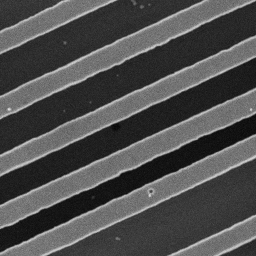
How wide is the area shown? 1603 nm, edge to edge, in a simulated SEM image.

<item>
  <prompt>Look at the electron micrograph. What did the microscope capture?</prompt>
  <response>lines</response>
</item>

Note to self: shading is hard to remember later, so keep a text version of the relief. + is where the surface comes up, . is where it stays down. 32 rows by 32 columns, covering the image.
.......+++++++...........++++++.
.....++++++...........+++++++...
...++++++...........+++++++.....
.++++++...........+++++++.......
+++++...........+++++++.........
+++...........+++++++.........++
+...........++++++.........+++++
..........++++++.........++++++.
.......+++++++.........++++++...
.....+++++++.........++++++.....
...+++++++.........++++++.......
.++++++..........++++++........+
+++++.........+++++++........+++
+++.........+++++++........+++++
+.........++++++........+++++++.
........++++++........+++++++...
......++++++........+++++++.....
....++++++........++++++......++
..++++++........++++++......++++
++++++.......+++++++......++++++
++++.......+++++++......++++++..
+........+++++++......++++++....
.......+++++++......++++++......
.....+++++++......++++++........
..+++++++......+++++++..........
+++++++......+++++++............
+++++......+++++++..............
+++......++++++................+
.......++++++...............++++
.....++++++...............++++++
..+++++++...............+++++++.
+++++++...............++++++....